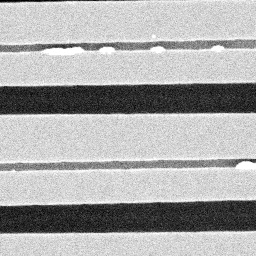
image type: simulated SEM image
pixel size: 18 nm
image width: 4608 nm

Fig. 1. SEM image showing lines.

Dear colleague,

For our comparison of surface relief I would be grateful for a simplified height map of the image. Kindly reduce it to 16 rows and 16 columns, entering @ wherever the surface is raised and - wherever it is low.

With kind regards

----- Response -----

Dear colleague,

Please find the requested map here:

@@@@@@@@@@@@@@@@
@@@@@@@@@@@@@@@@
@@@@@@@@@@@@@@@@
@@@@@@@@@@@@@@@@
@@@@@@@@@@@@@@@@
----------------
----------------
@@@@@@@@@@@@@@@@
@@@@@@@@@@@@@@@@
@@@@@@@@@@@@@@@@
@@@@@@@@@@@@@@@@
@@@@@@@@@@@@@@@@
@@@@@@@@@@@@@@--
----------------
-------------@@@
@@@@@@@@@@@@@@@@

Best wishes